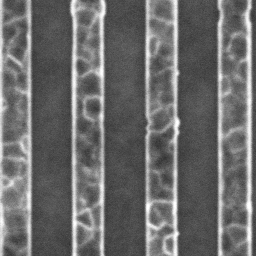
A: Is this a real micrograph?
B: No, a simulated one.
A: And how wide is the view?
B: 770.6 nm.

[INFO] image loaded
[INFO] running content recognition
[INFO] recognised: one or a few lines or trenches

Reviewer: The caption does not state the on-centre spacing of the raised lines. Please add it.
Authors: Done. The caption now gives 0.221 microns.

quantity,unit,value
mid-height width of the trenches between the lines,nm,129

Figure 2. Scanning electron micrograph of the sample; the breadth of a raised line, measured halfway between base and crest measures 91.9 nm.